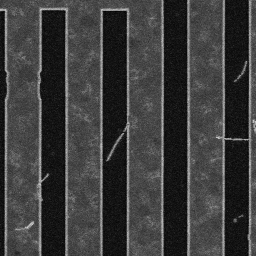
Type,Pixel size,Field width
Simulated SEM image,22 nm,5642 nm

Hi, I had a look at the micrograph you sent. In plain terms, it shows parallel lines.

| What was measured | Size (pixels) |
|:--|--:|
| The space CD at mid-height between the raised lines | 26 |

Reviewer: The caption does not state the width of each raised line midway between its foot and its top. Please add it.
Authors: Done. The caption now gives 35.1 px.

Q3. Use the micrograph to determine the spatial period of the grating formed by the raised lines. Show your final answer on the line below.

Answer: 1340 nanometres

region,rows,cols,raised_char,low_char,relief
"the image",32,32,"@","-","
@@@@@@@@@@@@@@@@@@@@----@@@@---@
-@@@@---@@@@@---@@@@----@@@@---@
-@@@@---@@@@@---@@@@----@@@@---@
-@@@@---@@@@@---@@@@----@@@@---@
-@@@@---@@@@@---@@@@----@@@@---@
-@@@@---@@@@@---@@@@----@@@@---@
-@@@@---@@@@@---@@@@----@@@@---@
-@@@@---@@@@@---@@@@----@@@@---@
-@@@@---@@@@@---@@@@----@@@@---@
-@@@@---@@@@@---@@@@----@@@@---@
-@@@@---@@@@@---@@@@----@@@@---@
-@@@@---@@@@@---@@@@----@@@@---@
-@@@@---@@@@@---@@@@----@@@@---@
-@@@@---@@@@@---@@@@----@@@@---@
-@@@@---@@@@@---@@@@----@@@@---@
-@@@@---@@@@@---@@@@----@@@@---@
-@@@@---@@@@@---@@@@----@@@@---@
-@@@@---@@@@@---@@@@----@@@@---@
-@@@@---@@@@@---@@@@----@@@@---@
-@@@@---@@@@@---@@@@----@@@@---@
-@@@@---@@@@@---@@@@----@@@@---@
-@@@@---@@@@@---@@@@----@@@@---@
-@@@@---@@@@@---@@@@----@@@@---@
-@@@@---@@@@@---@@@@----@@@@---@
-@@@@---@@@@@---@@@@----@@@@---@
-@@@@---@@@@@---@@@@----@@@@---@
-@@@@---@@@@@---@@@@----@@@@---@
-@@@@---@@@@@---@@@@----@@@@---@
-@@@@---@@@@@---@@@@----@@@@---@
-@@@@---@@@@@---@@@@----@@@@---@
-@@@@---@@@@@---@@@@----@@@@---@
-@@@@---@@@@@---@@@@----@@@@---@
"